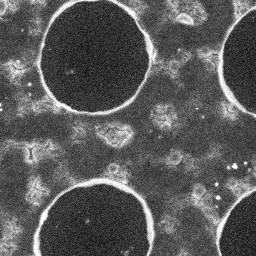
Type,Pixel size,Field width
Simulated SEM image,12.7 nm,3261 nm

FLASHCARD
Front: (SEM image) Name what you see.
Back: holes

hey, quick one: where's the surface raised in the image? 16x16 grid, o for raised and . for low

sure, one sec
oooo....oooooooo
ooo......oooooo.
ooo......ooooo..
ooo......ooooo..
ooo......ooooo..
ooo......ooooo..
oooo....ooooooo.
oooooooooooooooo
oooooooooooooooo
oooooooooooooooo
oooooooooooooooo
ooooo..ooooooooo
ooo......oooooo.
ooo......ooooo..
oo.......ooooo..
oo.......ooooo..